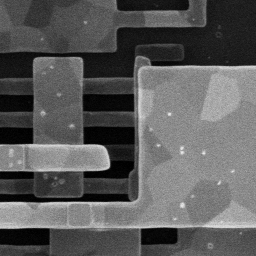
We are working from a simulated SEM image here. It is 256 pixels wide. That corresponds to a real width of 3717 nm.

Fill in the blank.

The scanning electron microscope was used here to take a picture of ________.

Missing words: wiring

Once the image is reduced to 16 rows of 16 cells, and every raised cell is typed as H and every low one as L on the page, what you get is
LLLLLLLLLLLLLLLL
LLLLLLLLLLLLLLLL
LLLLLLLLLLLLLLLL
LLLLLLLLLLLLLLLL
LLHHHLLLHHHHHHHH
LLHHHLLLHHHHHHHH
LLHHHLLLHHHHHHHH
LLHHHLLLHHHHHHHH
LLHHHLLLHHHHHHHH
HHHHHHHLHHHHHHHH
HHHHHHHLHHHHHHHH
LLHHHLLLHHHHHHHH
LLHHHLLLHHHHHHHH
HHHHHHHHHHHHHHHH
LLLHHHHHHLLLLLLL
LLLHHHHHHLLLLLLL